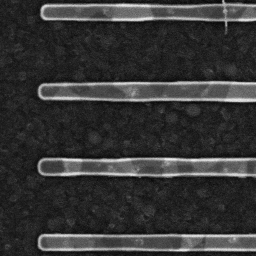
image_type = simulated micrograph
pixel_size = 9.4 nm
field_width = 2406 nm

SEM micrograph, one or a few lines or trenches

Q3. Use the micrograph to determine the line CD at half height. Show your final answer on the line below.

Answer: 136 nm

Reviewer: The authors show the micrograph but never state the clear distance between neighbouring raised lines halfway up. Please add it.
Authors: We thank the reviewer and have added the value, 583 nm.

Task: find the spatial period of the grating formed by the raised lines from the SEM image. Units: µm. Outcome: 0.722